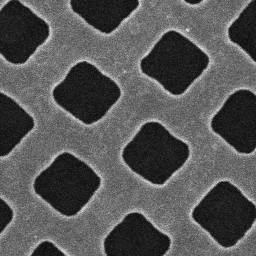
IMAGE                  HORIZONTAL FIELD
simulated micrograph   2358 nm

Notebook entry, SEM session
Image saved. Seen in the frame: holes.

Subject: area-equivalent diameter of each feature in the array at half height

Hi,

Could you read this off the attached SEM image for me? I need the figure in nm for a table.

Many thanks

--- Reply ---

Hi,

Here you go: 547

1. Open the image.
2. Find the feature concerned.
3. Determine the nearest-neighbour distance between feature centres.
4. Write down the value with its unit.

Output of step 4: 849 nm